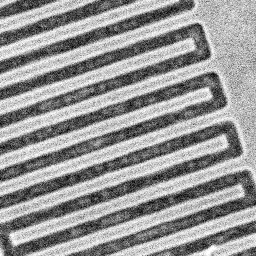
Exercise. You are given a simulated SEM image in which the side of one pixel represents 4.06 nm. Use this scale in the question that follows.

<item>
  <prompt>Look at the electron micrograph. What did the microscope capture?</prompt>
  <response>groups of lines, slits or small figures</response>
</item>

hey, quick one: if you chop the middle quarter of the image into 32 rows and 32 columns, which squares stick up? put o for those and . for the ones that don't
...........ooooooooo...........o
........ooooooooo...........oooo
.....ooooooooo............oooooo
..ooooooooo...........ooooooooo.
oooooooo............ooooooooo...
ooooo...........ooooooooo.......
oo...........oooooooooo.........
..........ooooooooo............o
.......oooooooooo...........oooo
.....ooooooooo...........ooooooo
..ooooooooo..........oooooooooo.
oooooooo...........ooooooooo....
oooo...........oooooooooo.......
oo...........ooooooooo..........
..........ooooooooo...........oo
......oooooooooo...........ooooo
....ooooooooo...........oooooooo
oooooooooo...........ooooooooo..
ooooooo...........ooooooooo.....
oooo...........ooooooooo........
o...........oooooooooo..........
.........ooooooooo............oo
......ooooooooo...........oooooo
...oooooooooo..........ooooooooo
ooooooooo...........ooooooooo...
oooooo...........oooooooooo.....
ooo...........ooooooooo.........
...........oooooooooo...........
.........ooooooooo...........ooo
.....oooooooooo...........oooooo
..oooooooooo...........ooooooooo
oooooooo............ooooooooo...